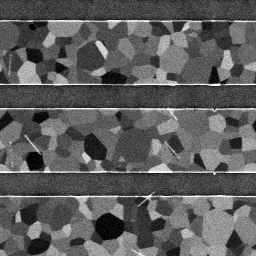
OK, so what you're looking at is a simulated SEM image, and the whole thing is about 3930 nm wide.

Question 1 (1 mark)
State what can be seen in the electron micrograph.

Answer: one or a few lines or trenches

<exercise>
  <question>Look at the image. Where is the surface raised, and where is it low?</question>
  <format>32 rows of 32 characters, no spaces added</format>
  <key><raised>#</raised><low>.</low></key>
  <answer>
................................
................................
................................
################################
################################
################################
################################
################################
################################
################################
##########..####################
................................
................................
................................
################################
################################
################################
################################
################################
################################
################################
###....######.##..####..#.#.####
................................
................................
..................#.............
################################
################################
################################
################################
################################
################################
################################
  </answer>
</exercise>